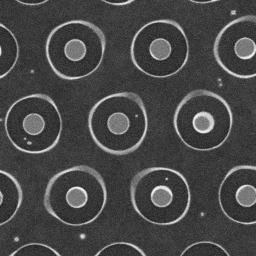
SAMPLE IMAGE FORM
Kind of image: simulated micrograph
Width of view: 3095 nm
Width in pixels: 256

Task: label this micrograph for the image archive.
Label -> an array of small figures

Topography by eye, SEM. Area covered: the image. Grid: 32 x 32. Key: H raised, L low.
HHHHHHHHHHHHHHHHHHHHHHHHHHHHHHHH
HHHHHHHHHHHHHHHHHHHHHHHHHHHHHHHH
HHHHHHHHHHHHHHHHHHHHHHHHHHHHHHLL
LHHHHHHLLLLLHHHHHHLLLLHHHHHHLLLL
LLHHHHLLLLLLLHHHHLLLLLLHHHHLLLLL
LLHHHHLLHHLLLHHHHLLHHLLHHHHLLLHH
LLHHHHLLHHHLLHHHLLLHHLLHHHHLLLHH
LLHHHHLLLHLLLHHHHLLLLLLHHHHLLLLL
LHHHHHHLLLLLHHHHHLLLLLLHHHHHLLLL
HHHHHHHHLLLHHHHHHHHLLHHHHHHHHHLH
HHHHHHHHHHHHHHHHHHHHHHHHHHHHHHHH
HHHHHHHHHHHHHHHHHHHHHHHHHHHHHHHH
HHHLLLHHHHHHHLLLLHHHHHHLLLLLHHHH
HLLLLLLHHHHHLLLLLLHHHHLLLLLLLHHH
HLLLHLLHHHHLLLHHLLHHHHLLLHLLLHHH
HLLHHLLLHHHLLHHHLLHHHHLLHHHLLHHH
HLLHHLLHHHHLLLHLLLHHHHLLLLLLLHHH
HLLLLLLHHHHHLLLLLLHHHHHLLLLLHHHH
HHLLLLHHHHHHHLLLLHHHHHHHLLHHHHHH
HHHHHHHHHHHHHHHHHHHHHHHHHHHHHHHH
HHHHHHHHHHHHHHHHHHHHHHHHHHHHHHHH
HHHHHHHHLLLLHHHHHHLLLLHHHHHHHLLL
LLHHHHHLLLLLHHHHHLLLLLLHHHHHLLLL
LLHHHHLLLLLLLHHHHLLLHLLLHHHHLLHH
LLLHHHLLHHHLLHHHHLLHHHLLHHHLLLHH
LLHHHHLLLHLLLHHHHLLHHLLLHHHHLLHH
LLHHHHLLLLLLHHHHHLLLLLLHHHHHLLLL
LHHHHHHHLLLLHHHHHHHLLLHHHHHHHLLL
HHHHHHHHHHHHHHHHHHHHHHHHHHHHHHHH
HHHHHHHHHHHHHHHHHHHHHHHHHHHHHHHH
HHHHHHHHHHHHHHLLHHHHHHHHLLLHHHHH
HHLLLLLHHHHHHLLLLLHHHHHLLLLLHHHH